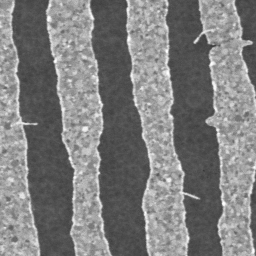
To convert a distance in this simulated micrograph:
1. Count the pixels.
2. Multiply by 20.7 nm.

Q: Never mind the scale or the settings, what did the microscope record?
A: one or a few lines or trenches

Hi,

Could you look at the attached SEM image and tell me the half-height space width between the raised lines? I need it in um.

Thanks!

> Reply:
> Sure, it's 0.821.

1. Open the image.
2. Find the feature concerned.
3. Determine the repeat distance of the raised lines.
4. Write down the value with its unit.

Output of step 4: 1550 nm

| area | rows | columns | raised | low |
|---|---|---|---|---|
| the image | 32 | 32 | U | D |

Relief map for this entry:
UUDDDDUUUUUDDDDDUUUUUDDDDUUUUDDD
UDDDDDUUUUUDDDDDUUUUUDDDDUUUUDDD
UDDDDDUUUUUUDDDDUUUUUDDDDUUUUUDD
UDDDDDUUUUUDDDDDUUUUUDDDDUUUUUDD
UDDDDDUUUUUDDDDDUUUUUDDDDDUUUUDD
UUDDDDUUUUUDDDDDUUUUUDDDDDUUUUUD
UUDDDDDUUUUUDDDDUUUUUDDDDDUUUUDD
UUDDDDDUUUUUDDDDDUUUUDDDDDUUUUDD
UUDDDDDUUUUUDDDDDUUUUDDDDDUUUUUD
UUDDDDDUUUUUDDDDUUUUUDDDDDDUUUUD
UUDDDDDUUUUUDDDDDUUUUDDDDDDUUUUD
UUDDDDDUUUUUDDDDDUUUUDDDDDDUUUUU
UUDDDDDDUUUUDDDDDUUUUUDDDDDUUUUU
UUDDDDDDUUUUUDDDDUUUUDDDDDDUUUUU
UUDDDDDDUUUUUDDDDDUUUDDDDDUUUUUU
UUUDDDDDUUUUUDDDDDUUUUDDDDUUUUUU
UUUDDDDDUUUUUDDDDDUUUUDDDDDUUUUU
UUUDDDDDUUUUDDDDDDUUUUDDDDDUUUUU
UUUDDDDDUUUUDDDDDDUUUUDDDDDUUUUU
UUUDDDDDDUUUDDDDDDDUUUDDDDDDUUUU
UUUDDDDDDUUUDDDDDDDUUUDDDDDDUUUU
UUUDDDDDDUUUDDDDDDDUUUUDDDDDUUUU
UUUDDDDDDUUUDDDDDDDUUUUDDDDDUUUU
UUUDDDDDDUUUDDDDDDUUUUUDDDDDUUUD
UUUUDDDDDUUUDDDDDDUUUUUDDDDDUUUD
UUUUDDDDDUUUUDDDDDUUUUUDDDDDUUUD
UUUUDDDDDUUUUDDDDDUUUUUDDDDDUUUD
UUUUDDDDDUUUUDDDDDUUUUUDDDDDUUUD
UUUUDDDDDUUUUDDDDDUUUUUDDDDUUUUD
UUUUUDDDDUUUUDDDDDUUUUUDDDDDUUUD
UUUUUDDDDUUUUDDDDDUUUUUDDDDDUUUU
UUUUUDDDDUUUUUDDDDDUUUUDDDDDUUUU